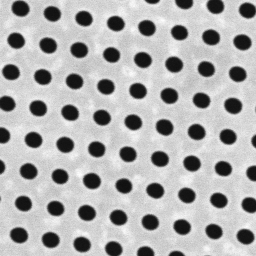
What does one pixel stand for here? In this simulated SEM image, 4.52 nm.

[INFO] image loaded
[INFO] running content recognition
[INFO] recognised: a regular array of holes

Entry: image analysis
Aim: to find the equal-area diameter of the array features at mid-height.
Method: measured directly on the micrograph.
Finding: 74.7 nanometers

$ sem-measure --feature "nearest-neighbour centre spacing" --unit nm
143